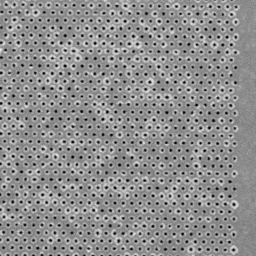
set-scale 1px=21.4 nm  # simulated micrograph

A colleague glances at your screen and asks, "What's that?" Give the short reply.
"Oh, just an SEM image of a regular array of holes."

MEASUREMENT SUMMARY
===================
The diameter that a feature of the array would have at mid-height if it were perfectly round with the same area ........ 72.6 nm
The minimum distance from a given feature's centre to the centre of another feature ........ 8.16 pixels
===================